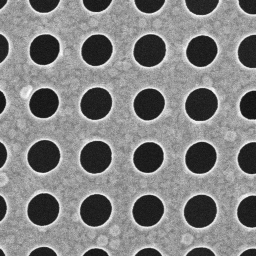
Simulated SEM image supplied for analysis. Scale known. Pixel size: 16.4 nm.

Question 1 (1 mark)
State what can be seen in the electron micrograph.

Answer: a regular array of holes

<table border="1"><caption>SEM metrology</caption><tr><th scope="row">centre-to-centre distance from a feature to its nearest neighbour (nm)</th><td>856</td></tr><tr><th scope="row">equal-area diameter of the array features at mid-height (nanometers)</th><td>523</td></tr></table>